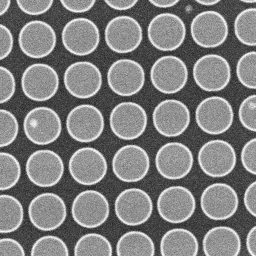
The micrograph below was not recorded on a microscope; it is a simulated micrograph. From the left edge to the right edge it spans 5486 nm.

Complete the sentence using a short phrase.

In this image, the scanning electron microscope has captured an array of small figures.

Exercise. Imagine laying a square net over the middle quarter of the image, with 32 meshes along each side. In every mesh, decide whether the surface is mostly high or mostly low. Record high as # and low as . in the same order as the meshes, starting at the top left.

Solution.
..######....#######...########..
.########..#########..#########.
#########..#########..#########.
#########..#########..#########.
#########..#########..########..
#########...########...#######..
.#######....#######.....#####...
..######......###...............
................................
.........................####...
....##.......######....#######..
..######....########...########.
.########...########..#########.
.#########..########..#########.
.#########..########..#########.
.#########..########...########.
.########...########...#######..
..#######....######......####...
...#####.......##...............
................................
................##.......#####..
....####......######....#######.
...######....########..#########
..########..#########..#########
..########..#########..#########
.##########.#########..#########
.#########..#########...#######.
..########...#######....#######.
..########....#####.......###...
....####........................
................................
................###......######.